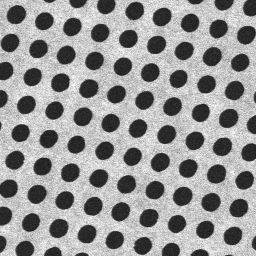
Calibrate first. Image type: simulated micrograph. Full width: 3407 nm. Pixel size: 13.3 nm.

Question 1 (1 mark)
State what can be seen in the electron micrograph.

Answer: a regular array of holes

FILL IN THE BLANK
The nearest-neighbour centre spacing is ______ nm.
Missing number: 376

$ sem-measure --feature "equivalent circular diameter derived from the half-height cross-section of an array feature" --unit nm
245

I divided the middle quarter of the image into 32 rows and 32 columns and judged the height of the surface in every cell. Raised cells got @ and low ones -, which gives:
@@@@@----@@@-----@@@---@@@@@@@@@
@@@@@@@-@@@@@----@@-----@@@@--@@
@@@@@@@@@@@@@---@@@-----@@@----@
-@@@@@@@@@@@@@@@@@@@---@@@-----@
-@@@@---@@@@@@@@@@@@@@@@@@-----@
-@@@-----@@@--@@@@@@@@@@@@@---@@
@@@@-----@@----@@@@@@@@@@@@@@@@@
@@@@----@@@----@@@@---@@@@@@@@@@
@@@@@@@@@@@----@@@----@@@@@-@@@@
@@@@@@@@@@@@--@@@@----@@@----@@@
@@@@@@@@@@@@@@@@@@----@@@----@@@
@@@----@@@@@@@@@@@@@@@@@@----@@@
@@@----@@@@-@@@@@@@@@@@@@@--@@@@
@@-----@@@----@@@@@@@@@@@@@@@@@@
@@@---@@@@----@@@---@@@@@@@@@@@@
@@@@-@@@@-----@@-----@@@@--@@@@@
@@@@@@@@@@---@@@-----@@@----@@@@
@@@@@@@@@@@@@@@@----@@@-----@@@-
@@---@@@@@@@@@@@@@@@@@@-----@@--
@----@@@@@-@@@@@@@@@@@@@---@@@--
@----@@@----@@@@@@@@@@@@@@@@@@@-
@----@@@----@@@@---@@@@@@@@@@@@@
@@@@@@@@----@@@----@@@@--@@@@@@@
@@@@@@@@---@@@@----@@@----@@@@@@
@@@@@@@@@@@@@@@----@@@-----@@@--
---@@@@@@@@@@@@@@@@@@@----@@@---
----@@@@--@@@@@@@@@@@@---@@@@---
----@@@----@@@@@@@@@@@@@@@@@@---
---@@@-----@@@---@@@@@@@@@@@@@@@
@@@@@@-----@@-----@@@@--@@@@@@@@
@@@@@@@---@@@-----@@@----@@@@@@@
@@@@@@@@@@@@@@---@@@-----@@@----